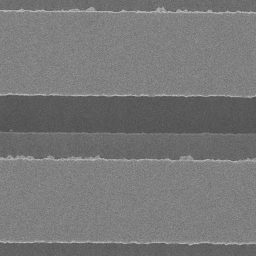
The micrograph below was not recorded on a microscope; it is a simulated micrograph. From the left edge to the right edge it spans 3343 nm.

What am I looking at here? lines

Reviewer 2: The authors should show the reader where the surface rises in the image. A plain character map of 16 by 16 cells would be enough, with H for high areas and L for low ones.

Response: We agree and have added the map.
HHHHHHHHHHHHHHHH
HHHHHHHHHHHHHHHH
HHHHHHHHHHHHHHHH
HHHHHHHHHHHHHHHH
HHHHHHHHHHHHHHHH
HHHHHHHHHHHHHHHH
LLLLLLLLLLLLLLLL
LLLLLLLLLLLLLLLL
HHHHHHHHHHHHHHHH
HHHHHHHHHHHHHHHH
HHHHHHHHHHHHHHHH
HHHHHHHHHHHHHHHH
HHHHHHHHHHHHHHHH
HHHHHHHHHHHHHHHH
HHHHHHHHHHHHHHHH
LLLLLLLLLLLLLLLL